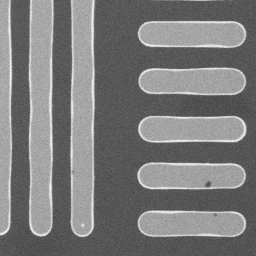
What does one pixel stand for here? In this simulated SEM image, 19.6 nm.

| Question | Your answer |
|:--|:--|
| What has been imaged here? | groups of lines, slits or small figures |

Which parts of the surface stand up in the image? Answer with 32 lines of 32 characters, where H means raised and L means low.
HLLLHHHLLHHHLLLLLLLLLLLLLLLLLLLL
HLLLHHHLLHHHLLLLLLLLLLLLLLLLLLLL
HLLLHHHLLHHHLLLLLLLLLLLLLLLLLLLL
HLLLHHHLLHHHLLLLLLHHHHHHHHHHHHLL
HLLLHHLLLHHHLLLLLHHHHHHHHHHHHHHL
HLLLHHLLLHHHLLLLLLHHHHHHHHHHHHLL
HLLLHHLLLHHHLLLLLLLLLLLLLLLLLLLL
HLLLHHLLLHHHLLLLLLLLLLLLLLLLLLLL
HLLLHHLLLHHHLLLLLLLLLLLLLLLLLLLL
HLLLHHLLLHHHLLLLLLHHHHHHHHHHHHLL
HLLLHHLLLHHHLLLLLHHHHHHHHHHHHHHL
HLLLHHLLLHHHLLLLLLHHHHHHHHHHHHLL
HLLLHHLLLHHHLLLLLLLLLLLLLLLLLLLL
HLLLHHLLLHHHLLLLLLLLLLLLLLLLLLLL
HLLLHHLLLHHHLLLLLLLLLLLLLLLLLLLL
HLLLHHLLLHHHLLLLLHHHHHHHHHHHHHHL
HLLLHHLLLHHHLLLLLHHHHHHHHHHHHHHL
HLLLHHLLLHHHLLLLLLHHHHHHHHHHHHLL
HLLLHHLLLHHHLLLLLLLLLLLLLLLLLLLL
HLLLHHLLLHHHLLLLLLLLLLLLLLLLLLLL
HLLLHHLLLHHHLLLLLLHHHHLLLLLLLLLL
HLLLHHLLLHHHLLLLLHHHHHHHHHHHHHHL
HLLLHHLLLHHHLLLLLHHHHHHHHHHHHHHL
HLLLHHLLLHHHLLLLLLHHHHHHHHHHHLLL
HLLLHHLLLHHHLLLLLLLLLLLLLLLLLLLL
HLLLHHLLLHHHLLLLLLLLLLLLLLLLLLLL
HLLLHHLLLHHHLLLLLLHHHHHHHHLLHLLL
HLLLHHLLLHHHLLLLLHHHHHHHHHHHHHHL
HLLLHHLLLHHHLLLLLHHHHHHHHHHHHHHL
LLLLLLLLLLLLLLLLLLLLLLLLLLLLLLLL
LLLLLLLLLLLLLLLLLLLLLLLLLLLLLLLL
LLLLLLLLLLLLLLLLLLLLLLLLLLLLLLLL